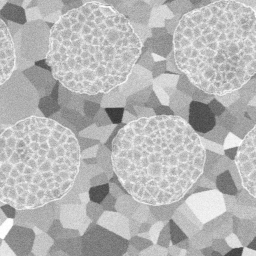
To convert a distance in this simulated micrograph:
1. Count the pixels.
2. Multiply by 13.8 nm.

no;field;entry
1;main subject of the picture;holes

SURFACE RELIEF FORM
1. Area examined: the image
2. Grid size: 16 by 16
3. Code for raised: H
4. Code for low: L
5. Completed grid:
HHHHHLHHHHHHHLLL
HHHLLLLLHHHLLLLL
LHHLLLLLLHHLLLLL
LHHLLLLLLHHLLLLL
LHHLLLLLHHHHLLLL
HHHHLLLHHHHHHLLH
HHHHHHHHHHHHHHHH
HLLHHHHHHLLHHHHH
LLLLLHHLLLLLHHHL
LLLLLHHLLLLLLHHL
LLLLLHHLLHLLLHHL
LLLLHHHHLLLLHHHL
LLLHHHHHHLLHHHHH
HHHHHHHHHHHHHHHH
HHHHHHHHHHHHHHHH
HHHHHHHHHHHHHHHH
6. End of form